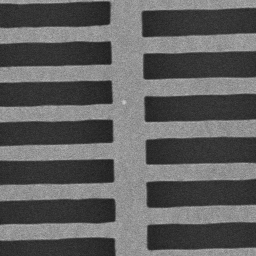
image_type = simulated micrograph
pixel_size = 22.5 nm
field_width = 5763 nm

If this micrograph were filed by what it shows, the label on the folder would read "groups of lines, slits or small figures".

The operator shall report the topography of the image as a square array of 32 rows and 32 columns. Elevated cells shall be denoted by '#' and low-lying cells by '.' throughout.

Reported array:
..............##################
..............####..............
..............####..............
..##.#############..............
##################.....#########
..............##################
..............##########........
..............####..............
##################..............
##################..............
..............##################
..............##################
..............####..............
##################..............
##################..............
..............##################
..............##################
..............#####.............
##################..............
##################..............
..............#####.........####
..............##################
..............#############.....
##################..............
##################..............
..............####..............
...............#################
..............##################
##################..............
##################..............
..............####..............
..............##################